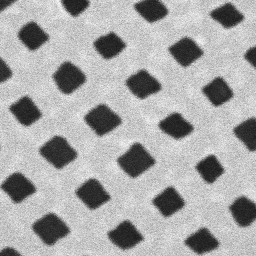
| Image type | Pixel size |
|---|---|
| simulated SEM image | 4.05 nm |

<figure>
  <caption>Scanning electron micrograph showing a regular array of holes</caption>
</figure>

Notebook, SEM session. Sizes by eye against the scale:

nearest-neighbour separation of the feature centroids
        213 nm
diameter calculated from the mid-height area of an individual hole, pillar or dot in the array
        118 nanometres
